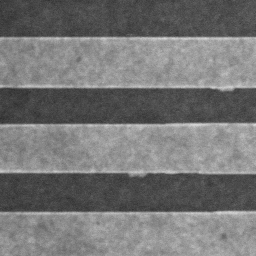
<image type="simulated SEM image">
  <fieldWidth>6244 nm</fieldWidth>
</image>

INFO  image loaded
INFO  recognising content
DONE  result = lines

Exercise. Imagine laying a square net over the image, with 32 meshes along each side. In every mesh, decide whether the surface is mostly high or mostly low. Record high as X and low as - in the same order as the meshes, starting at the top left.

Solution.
--------------------------------
--------------------------------
--------------------------------
--------------------------------
--------------------------------
XXXXXXXXXXXXXXXXXXXXXXXXXXXXXXXX
XXXXXXXXXXXXXXXXXXXXXXXXXXXXXXXX
XXXXXXXXXXXXXXXXXXXXXXXXXXXXXXXX
XXXXXXXXXXXXXXXXXXXXXXXXXXXXXXXX
XXXXXXXXXXXXXXXXXXXXXXXXXXXXXXXX
XXXXXXXXXXXXXXXXXXXXXXXXXXXXXXXX
--------------------------------
--------------------------------
--------------------------------
--------------------------------
-------------------------XXXXXXX
XXXXXXXXXXXXXXXXXXXXXXXXXXXXXXXX
XXXXXXXXXXXXXXXXXXXXXXXXXXXXXXXX
XXXXXXXXXXXXXXXXXXXXXXXXXXXXXXXX
XXXXXXXXXXXXXXXXXXXXXXXXXXXXXXXX
XXXXXXXXXXXXXXXXXXXXXXXXXXXXXXXX
XX-XXXXXXXXXXXXXXXXXXXXXXXXXXXXX
--------------------------------
--------------------------------
--------------------------------
--------------------------------
--------------------------------
XXXXXXXXXXXXXXXXXXXXXXXXXXXXXXXX
XXXXXXXXXXXXXXXXXXXXXXXXXXXXXXXX
XXXXXXXXXXXXXXXXXXXXXXXXXXXXXXXX
XXXXXXXXXXXXXXXXXXXXXXXXXXXXXXXX
XXXXXXXXXXXXXXXXXXXXXXXXXXXXXXXX